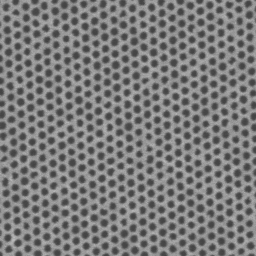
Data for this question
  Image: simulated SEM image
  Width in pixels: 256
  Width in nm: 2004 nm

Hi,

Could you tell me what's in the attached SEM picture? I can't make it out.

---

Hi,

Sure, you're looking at a regular array of holes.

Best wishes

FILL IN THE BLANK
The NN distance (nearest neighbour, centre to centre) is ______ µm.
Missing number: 0.0846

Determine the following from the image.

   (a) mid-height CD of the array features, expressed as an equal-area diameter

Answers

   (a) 61.9 nm